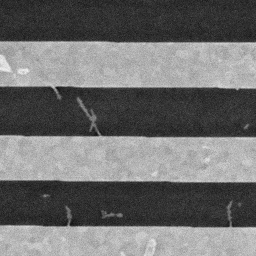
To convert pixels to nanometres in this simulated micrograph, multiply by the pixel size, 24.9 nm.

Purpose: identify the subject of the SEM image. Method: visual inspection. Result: lines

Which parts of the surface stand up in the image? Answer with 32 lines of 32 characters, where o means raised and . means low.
................................
................................
................................
................................
................................
oooooooooooooooooooooooooooooooo
oooooooooooooooooooooooooooooooo
oooooooooooooooooooooooooooooooo
oooooooooooooooooooooooooooooooo
oooooooooooooooooooooooooooooooo
oooooooooooooooooooooooooooooooo
................................
................................
................................
................................
................................
................................
oooooooooooooooooooooooooooooooo
oooooooooooooooooooooooooooooooo
oooooooooooooooooooooooooooooooo
oooooooooooooooooooooooooooooooo
oooooooooooooooooooooooooooooooo
........oooooooooooooooooooooooo
................................
................................
................................
................................
................................
oooooooooooooooooooooooo....o...
oooooooooooooooooooooooooooooooo
oooooooooooooooooooooooooooooooo
oooooooooooooooooooooooooooooooo